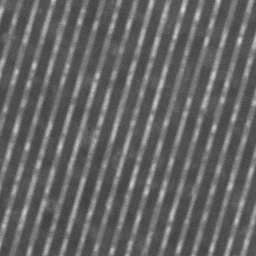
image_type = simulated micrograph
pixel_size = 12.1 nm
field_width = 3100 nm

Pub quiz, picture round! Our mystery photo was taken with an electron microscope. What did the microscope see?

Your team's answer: parallel lines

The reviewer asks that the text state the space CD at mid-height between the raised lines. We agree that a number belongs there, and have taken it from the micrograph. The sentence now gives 12.6 pixels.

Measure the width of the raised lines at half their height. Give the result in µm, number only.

0.0436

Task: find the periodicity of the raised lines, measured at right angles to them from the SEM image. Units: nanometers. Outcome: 192